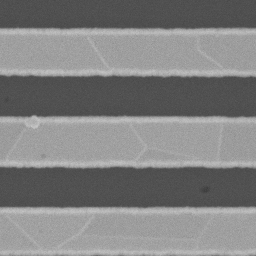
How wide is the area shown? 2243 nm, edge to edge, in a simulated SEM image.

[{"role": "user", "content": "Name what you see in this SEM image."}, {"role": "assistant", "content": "lines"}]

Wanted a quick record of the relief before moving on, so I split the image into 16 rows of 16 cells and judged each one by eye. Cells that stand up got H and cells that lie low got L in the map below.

LLLLLLLLLLLLLLLL
LLLLLLLLLLLLLLLL
HHHHHHHHHHHHHHHH
HHHHHHHHHHHHHHHH
HHHHHHHHHHHHHHHH
LLLLLLLLLLLLLLLL
LLLLLLLLLLLLLLLL
HHHHHHHHHHHHHHHH
HHHHHHHHHHHHHHHH
HHHHHHHHHHHHHHHH
LLLLLLLLLLLLLLLL
LLLLLLLLLLLLLLLL
LLLLLLLLLLLLLLLL
HHHHHHHHHHHHHHHH
HHHHHHHHHHHHHHHH
HHHHHHHHHHHHHHHH